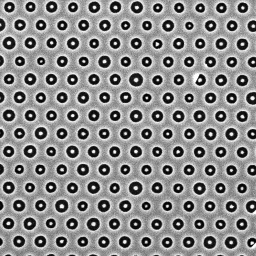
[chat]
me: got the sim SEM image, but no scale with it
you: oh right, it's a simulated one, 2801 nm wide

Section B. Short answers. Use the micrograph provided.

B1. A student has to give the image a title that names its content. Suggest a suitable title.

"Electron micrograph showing a regular array of ring-shaped grooves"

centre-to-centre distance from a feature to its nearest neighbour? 226 nanometres